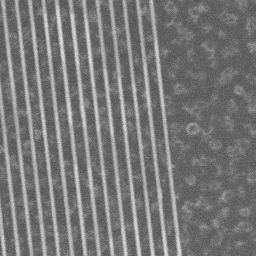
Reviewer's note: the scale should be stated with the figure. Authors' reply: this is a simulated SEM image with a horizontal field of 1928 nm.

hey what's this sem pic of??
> parallel lines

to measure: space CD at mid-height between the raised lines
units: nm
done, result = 82.3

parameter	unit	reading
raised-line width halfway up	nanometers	17.7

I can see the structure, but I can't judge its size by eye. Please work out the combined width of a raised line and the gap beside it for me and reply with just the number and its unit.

0.101 microns